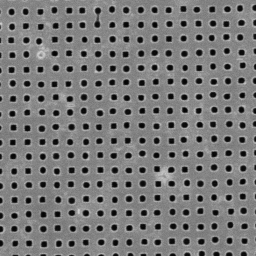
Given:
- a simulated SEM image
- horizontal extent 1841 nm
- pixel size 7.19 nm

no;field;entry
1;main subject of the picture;a regular array of holes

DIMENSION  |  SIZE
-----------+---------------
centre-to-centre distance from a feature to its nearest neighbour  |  97.6 nm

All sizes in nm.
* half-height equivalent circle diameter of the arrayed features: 48